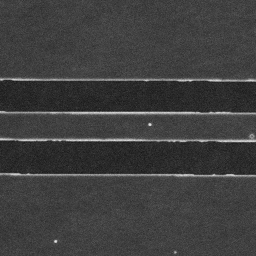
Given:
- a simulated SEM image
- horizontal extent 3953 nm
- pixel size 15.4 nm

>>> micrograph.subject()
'lines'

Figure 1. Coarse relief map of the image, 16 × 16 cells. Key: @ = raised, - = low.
@@@@@@@@@@@@@@@@
@@@@@@@@@@@@@@@@
@@@@@@@@@@@@@@@@
@@@@@@@@@@@@@@@@
@@@@@@@@@@@@@@@@
----------------
----------------
@@@@@@@@@@@@@@@@
@@@@@@@@@@@@@@@@
----------------
----------------
@@@@@@@@@@@@@@@@
@@@@@@@@@@@@@@@@
@@@@@@@@@@@@@@@@
@@@@@@@@@@@@@@@@
@@@@@@@@@@@@@@@@